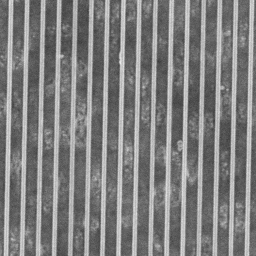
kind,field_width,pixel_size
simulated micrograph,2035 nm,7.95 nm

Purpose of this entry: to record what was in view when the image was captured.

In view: parallel lines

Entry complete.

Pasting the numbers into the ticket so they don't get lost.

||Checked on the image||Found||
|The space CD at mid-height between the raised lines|101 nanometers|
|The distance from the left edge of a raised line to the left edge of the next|128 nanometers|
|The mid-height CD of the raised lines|26.8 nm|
